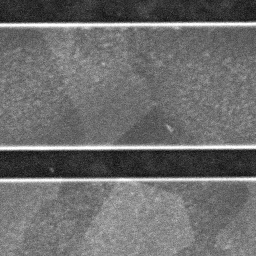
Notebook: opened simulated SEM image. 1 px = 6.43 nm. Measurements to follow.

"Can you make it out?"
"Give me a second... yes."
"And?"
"one or a few lines or trenches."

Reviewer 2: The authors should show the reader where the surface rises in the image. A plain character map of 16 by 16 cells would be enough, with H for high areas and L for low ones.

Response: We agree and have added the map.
LLLLLLLLLLLLLLLL
LLLLLLLLLLLLLLLH
HHHHHHHHHHHHHHHH
HHHHHHHHHHHHHHHH
HHHHHHHHHHHHHHHH
HHHHHHHHHHHHHHHH
HHHHHHHHHHHHHHHH
HHHHHHHHHHHHHHHH
HHHHHHHHHHHHHHHH
LLLLLLLLLLLLLLLL
LLLLLLLLLLLLLLLL
HHHHHHHHHHHHHHHH
HHHHHHHHHHHHHHHH
HHHHHHHHHHHHHHHH
HHHHHHHHHHHHHHHH
HHHHHHHHHHHHHHHH